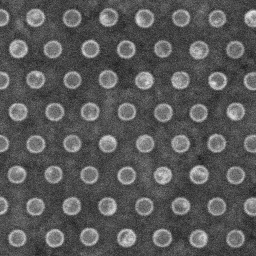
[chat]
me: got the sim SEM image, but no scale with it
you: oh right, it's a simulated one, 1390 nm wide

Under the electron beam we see a regular array of raised bodies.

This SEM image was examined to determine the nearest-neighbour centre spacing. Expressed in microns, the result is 0.193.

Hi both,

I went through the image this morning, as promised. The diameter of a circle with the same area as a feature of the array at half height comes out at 90.9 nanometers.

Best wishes